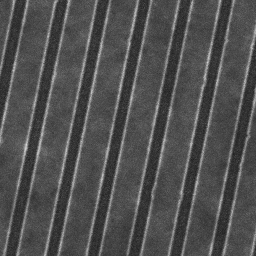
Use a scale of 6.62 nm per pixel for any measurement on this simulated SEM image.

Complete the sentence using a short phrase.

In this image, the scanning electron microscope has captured parallel lines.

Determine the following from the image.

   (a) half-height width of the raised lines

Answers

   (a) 180 nanometers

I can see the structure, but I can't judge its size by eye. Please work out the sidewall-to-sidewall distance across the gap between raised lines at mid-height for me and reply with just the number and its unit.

0.0844 microns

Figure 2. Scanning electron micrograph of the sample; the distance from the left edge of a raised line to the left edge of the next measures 267 nm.